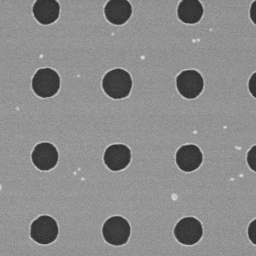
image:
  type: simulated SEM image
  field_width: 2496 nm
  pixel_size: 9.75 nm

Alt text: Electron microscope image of a regular array of holes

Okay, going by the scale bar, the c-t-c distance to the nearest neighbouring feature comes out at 0.701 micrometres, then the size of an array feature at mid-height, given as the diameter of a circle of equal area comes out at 0.282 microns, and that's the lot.